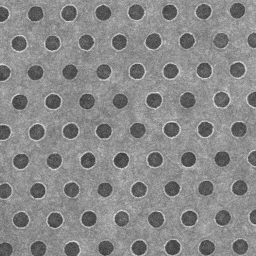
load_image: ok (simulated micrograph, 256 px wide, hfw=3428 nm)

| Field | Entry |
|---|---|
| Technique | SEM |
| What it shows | a regular array of holes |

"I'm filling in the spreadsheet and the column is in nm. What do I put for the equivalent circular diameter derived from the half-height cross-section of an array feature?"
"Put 210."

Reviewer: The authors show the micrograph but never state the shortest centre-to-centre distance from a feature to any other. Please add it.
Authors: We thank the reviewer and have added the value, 447 nm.